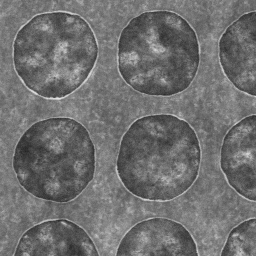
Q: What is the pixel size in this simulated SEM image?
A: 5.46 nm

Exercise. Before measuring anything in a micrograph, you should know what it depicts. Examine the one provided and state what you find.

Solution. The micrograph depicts holes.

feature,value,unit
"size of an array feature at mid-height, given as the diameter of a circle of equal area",465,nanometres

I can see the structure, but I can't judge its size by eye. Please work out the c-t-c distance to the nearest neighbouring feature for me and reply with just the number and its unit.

104 pixels